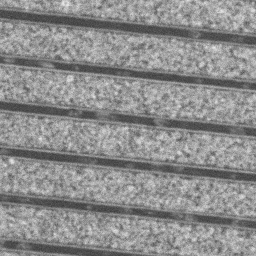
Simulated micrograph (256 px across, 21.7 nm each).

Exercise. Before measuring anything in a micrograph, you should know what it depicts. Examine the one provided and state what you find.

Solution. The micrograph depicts parallel lines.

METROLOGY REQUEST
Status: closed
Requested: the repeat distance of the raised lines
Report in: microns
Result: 0.989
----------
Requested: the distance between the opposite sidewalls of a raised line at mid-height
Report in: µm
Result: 0.787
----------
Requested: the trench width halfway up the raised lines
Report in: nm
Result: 213